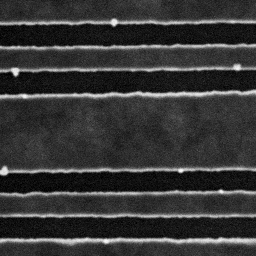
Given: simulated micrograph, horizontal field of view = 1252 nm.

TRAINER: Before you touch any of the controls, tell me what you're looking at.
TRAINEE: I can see lines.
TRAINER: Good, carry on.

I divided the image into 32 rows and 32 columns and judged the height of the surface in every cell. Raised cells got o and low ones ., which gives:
oooooooooooooooooooooooooooooooo
oooooooooooooooooooooooooooooooo
oooooooooooooooooooooooooooooooo
................................
................................
................................
oooooooooooooooooooooooooooooooo
oooooooooooooooooooooooooooooooo
oooooooooooooooooooooooooooooooo
................................
................................
............................oo.o
oooooooooooooooooooooooooooooooo
oooooooooooooooooooooooooooooooo
oooooooooooooooooooooooooooooooo
oooooooooooooooooooooooooooooooo
oooooooooooooooooooooooooooooooo
oooooooooooooooooooooooooooooooo
oooooooooooooooooooooooooooooooo
oooooooooooooooooooooooooooooooo
oooooooooooooooooooooooooooooooo
ooooo.oooo......................
................................
................................
oooooooooooooooooooooooooooooooo
oooooooooooooooooooooooooooooooo
oooooooooooooooooooooooooooooooo
................................
................................
................................
oooooooooooooooooooooooooooooooo
oooooooooooooooooooooooooooooooo